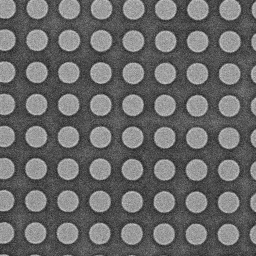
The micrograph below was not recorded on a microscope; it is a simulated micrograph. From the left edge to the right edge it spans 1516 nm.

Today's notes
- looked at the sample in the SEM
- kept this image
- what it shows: an array of small figures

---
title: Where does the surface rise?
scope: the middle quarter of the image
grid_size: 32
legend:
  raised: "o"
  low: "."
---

ooo....oooo.....ooo.....ooo.....
oooo...ooooo...ooooo...ooooo...o
oooo...ooooo...ooooo...ooooo...o
ooo....oooo....ooooo...ooooo...o
oo......ooo.....ooo.....ooo.....
................................
................................
................................
ooo....oooo....oooo.....ooo.....
oooo...ooooo...ooooo...ooooo...o
oooo...ooooo...ooooo...ooooo...o
ooo....oooo....oooo....ooooo...o
oo......ooo.....ooo.....ooo.....
................................
................................
................................
ooo....oooo....oooo.....ooo.....
oooo...ooooo...ooooo...ooooo...o
oooo...ooooo...ooooo...ooooo...o
ooo....oooo....oooo....ooooo...o
oo......oo......ooo.....ooo.....
................................
................................
................................
ooo....oooo....oooo....oooo.....
ooo....ooooo...oooo....oooo....o
ooo....ooooo...ooooo...ooooo...o
ooo....oooo....oooo....oooo....o
oo......oo......ooo.....ooo....o
................................
................................
................................